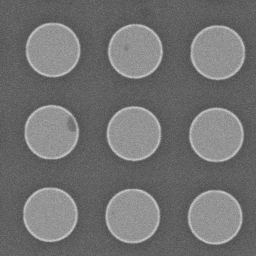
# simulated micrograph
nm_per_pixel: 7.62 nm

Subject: an array of small figures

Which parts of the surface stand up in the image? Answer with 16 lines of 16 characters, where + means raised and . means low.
................
...+............
..+++..+++..+++.
..+++..+++..+++.
..++...++....++.
................
................
..+++..+++..+++.
..+++..+++..+++.
..++...+++..+++.
................
................
..++...+++..+++.
..+++..+++..+++.
..++...+++..+++.
................